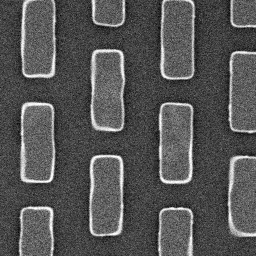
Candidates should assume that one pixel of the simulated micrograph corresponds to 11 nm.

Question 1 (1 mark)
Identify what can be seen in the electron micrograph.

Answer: groups of lines, slits or small figures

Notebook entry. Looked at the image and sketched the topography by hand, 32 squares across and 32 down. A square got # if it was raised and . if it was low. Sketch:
...####.....###.....####.....###
...####.....###.....####.....###
...####.....###.....####.....###
...####.............####........
...####.............####........
...####.............####........
...####.....###.....####........
...####.....###.....####.....###
...####.....###.....####.....###
...##.......###......###.....###
............###..............###
............###..............###
...........####..............###
...####....####.....####.....###
...####.....###.....####.....###
...####.....###.....####.....###
...####.............####........
...####.............####........
...####.............####........
...####.............####........
...####....####.....####.....###
...####....####.....####.....###
...###.....####.....###......###
...........####..............###
...........####..............###
...........####..............###
...###.....####.....####.....###
...###.....####.....####.....###
...###.....####.....####.....###
...####.............####........
...####.............####........
...####.............####........